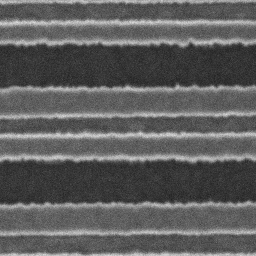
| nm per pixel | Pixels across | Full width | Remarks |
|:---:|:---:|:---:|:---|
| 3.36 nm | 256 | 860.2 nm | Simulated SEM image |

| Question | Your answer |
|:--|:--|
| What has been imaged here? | lines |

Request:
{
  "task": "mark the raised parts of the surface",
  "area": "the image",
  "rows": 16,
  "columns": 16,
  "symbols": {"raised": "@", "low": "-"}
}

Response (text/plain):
@@@@@@@@@@@@@@@@
@@@@@@@@@@@@@@@@
@@@@@@@@@@@@@@@@
----------------
----------------
@@@@@@@@@@@@@@@@
@@@@@@@@@@@@@@@@
@@@@@@@@@@@@@@@@
@@@@@@@@@@@@@@@@
@@@@@@@@@@@@@@@@
----------------
----------------
----------------
@@@@@@@@@@@@@@@@
@@@@@@@@@@@@@@@@
@@@@@@@@@@@@@@@@